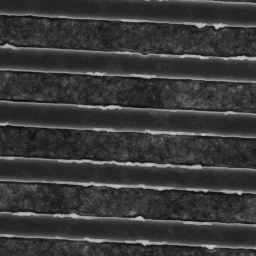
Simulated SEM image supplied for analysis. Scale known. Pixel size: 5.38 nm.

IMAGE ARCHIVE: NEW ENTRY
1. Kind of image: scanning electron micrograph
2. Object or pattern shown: parallel lines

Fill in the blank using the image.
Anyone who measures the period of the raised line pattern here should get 0.297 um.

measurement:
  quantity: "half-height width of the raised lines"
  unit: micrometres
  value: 0.13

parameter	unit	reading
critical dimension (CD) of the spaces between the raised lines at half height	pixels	31.4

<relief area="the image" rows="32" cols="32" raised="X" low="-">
XXXXXXXXXXXXXXXXXXXXXXXXXXXXXXXX
XXXXXXXXXXXXXXXXXXXXXXXXXXXXXXXX
--------------XXXXXXXXXXXXXXXXXX
---------------------------X----
--------------------------------
--------------------------------
XXXXXXXXXXXXX-XX----------------
XXXXXXXXXXXXXXXXXXXXXXXXXXXXXXXX
XXXXXXXXXXXXXXXXXXXXXXXXXXXXXXXX
---------------XXXXXXXXXXXXXXXXX
--------------------------------
--------------------------------
--------------------------------
XXXXXXXXXXXXXXXX----------------
XXXXXXXXXXXXXXXXXXXXXXXXXXXXXXXX
XXXXXXXXXXXXXXXXXXXXXXXXXXXXXXXX
-----------------XXXXXXXXXXXXXXX
--------------------------------
--------------------------------
--------------------------------
XXXXXXXXXXXXXXXXXXXX------------
XXXXXXXXXXXXXXXXXXXXXXXXXXXXXXXX
XXXXXXXXXXXXXXXXXXXXXXXXXXXXXXXX
--------------X---XXXXXXXXXXXXXX
--------------------------------
--------------------------------
---X----------------------------
XXXXXXXXXXXXXXXXXXX-------------
XXXXXXXXXXXXXXXXXXXXXXXXXXXXXXXX
XXXXXXXXXXXXXXXXXXXXXXXXXXXXXXXX
------------------XXXXXXXXXXXXXX
--------------------------------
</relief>